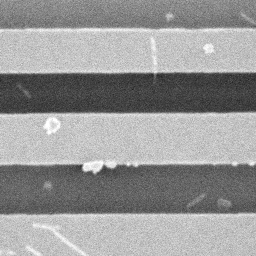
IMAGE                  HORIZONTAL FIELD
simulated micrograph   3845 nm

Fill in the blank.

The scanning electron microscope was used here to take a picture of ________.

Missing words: lines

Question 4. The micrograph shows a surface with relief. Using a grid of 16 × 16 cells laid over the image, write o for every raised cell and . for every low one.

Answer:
................
................
oooooooooooooooo
oooooooooooooooo
oooo.ooo.o......
................
................
oooooooooooooooo
oooooooooooooooo
oooooooooooooooo
.....o..........
................
................
oooooooooooooooo
oooooooooooooooo
oooooooooooooooo